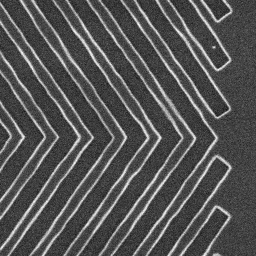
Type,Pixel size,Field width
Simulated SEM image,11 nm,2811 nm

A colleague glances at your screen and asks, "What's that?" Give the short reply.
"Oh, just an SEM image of groups of lines, slits or small figures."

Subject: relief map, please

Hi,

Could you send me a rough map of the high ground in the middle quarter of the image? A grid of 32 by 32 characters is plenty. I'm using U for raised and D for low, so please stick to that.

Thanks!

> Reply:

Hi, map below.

UUUDDDDDDUUUDDDDDUUUUDDDDDUUUDDD
DUUUDDDDDUUUUDDDDDUUUDDDDDUUUUDD
DUUUUDDDDDUUUDDDDDUUUUDDDDDUUUDD
DDUUUUDDDDDUUUDDDDDUUUUDDDDDUUUD
DDDUUUDDDDDUUUUDDDDDUUUDDDDDDUUU
DDDDUUUDDDDDUUUUDDDDDUUUDDDDDUUU
DDDDUUUUDDDDDUUUDDDDDUUUDDDDDDUU
DDDDDUUUDDDDDDUUUDDDDDUUUDDDDDDU
DDDDDDUUUDDDDDUUUUDDDDDUUUDDDDDU
UDDDDDUUUUDDDDDUUUDDDDDDUUDDDDDD
UUDDDDDUUUDDDDDUUUUDDDDDDUUDDDDD
UUUDDDDDUUUDDDDDUUUUDDDDDUUUDDDD
UUUDDDDDDUUUDDDDDUUUDDDDDDUUDDDD
UUUUDDDDDUUUDDDDDDUUUDDDDDDUUDDD
DUUUDDDDDDUUUDDDDDDUUDDDDDDUUUDD
DDUUUDDDDDUUUUDDDDDDUUDDDDDDUUUD
DDDUUUDDDDDUUUDDDDDDUUUDDDDDUUUD
DDDUUUUDDDDDUUUDDDDDDUUDDDDDDUUU
DDDDUUUDDDDDUUUDDDDDDUUUDDDDDUUU
DDDUUUDDDDDDUUUDDDDDUUUDDDDDDUUU
DDDUUUDDDDDUUUDDDDDDUUUDDDDDUUUU
DDUUUDDDDDUUUUDDDDDUUUDDDDDUUUUD
DUUUDDDDDDUUUDDDDDUUUDDDDDDUUUDD
UUUDDDDDDUUUDDDDDUUUUDDDDDUUUDDD
UUUDDDDDUUUDDDDDDUUUDDDDDUUUUDDD
UUDDDDDUUUUDDDDDUUUUDDDDDUUUDDDD
UUDDDDDUUUDDDDDUUUUDDDDDUUUDDDDD
UDDDDDUUUUDDDDDUUUDDDDDUUUDDDDDD
DDDDDUUUUDDDDDUUUDDDDDDUUUDDDDDU
DDDDUUUUDDDDDUUUDDDDDDUUUDDDDDUU
DDDDUUUDDDDDUUUDDDDDDUUUDDDDDDUU
DDDUUUUDDDDDUUUDDDDDDUUDDDDDDUUU